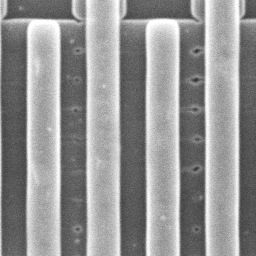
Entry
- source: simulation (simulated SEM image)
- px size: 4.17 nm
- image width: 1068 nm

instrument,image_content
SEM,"wiring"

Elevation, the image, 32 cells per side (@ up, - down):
-----------@@@@-----------@@@@--
-----------@@@@-----------@@@@--
-----------@@@------------@@@@--
----@@@----@@@----@@@@----@@@@--
----@@@----@@@@---@@@@----@@@@--
----@@@----@@@@---@@@@----@@@@--
----@@@----@@@@---@@@@----@@@@--
----@@@----@@@@---@@@@----@@@@--
----@@@----@@@@---@@@@----@@@@--
----@@@----@@@@---@@@@----@@@@--
----@@@----@@@@---@@@@----@@@@--
----@@@----@@@@---@@@@----@@@@--
----@@@----@@@@---@@@@----@@@@--
----@@@----@@@@---@@@@----@@@@--
----@@@----@@@@---@@@@----@@@@--
----@@@----@@@@---@@@@----@@@@--
----@@@----@@@@---@@@@----@@@@--
----@@@----@@@@---@@@@----@@@@--
----@@@----@@@@---@@@@----@@@@--
----@@@----@@@@---@@@@----@@@@--
----@@@----@@@@---@@@@----@@@@--
----@@@----@@@@---@@@@----@@@@--
----@@@----@@@@---@@@@----@@@@--
----@@@----@@@@---@@@@----@@@@--
----@@@----@@@@---@@@@----@@@@--
----@@@----@@@@---@@@@----@@@@--
----@@@----@@@@---@@@@----@@@@--
----@@@----@@@@---@@@@----@@@@--
----@@@----@@@@---@@@@----@@@@--
----@@@----@@@@---@@@@----@@@@--
----@@@----@@@@---@@@@----@@@@--
----@@@----@@@@---@@@@----@@@@--